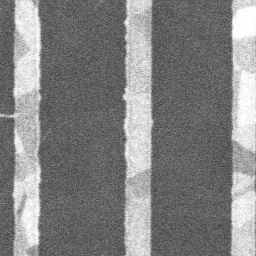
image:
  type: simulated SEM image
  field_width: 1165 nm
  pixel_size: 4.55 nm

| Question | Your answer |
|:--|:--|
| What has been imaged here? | one or a few lines or trenches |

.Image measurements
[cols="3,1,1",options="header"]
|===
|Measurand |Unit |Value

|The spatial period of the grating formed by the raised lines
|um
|0.495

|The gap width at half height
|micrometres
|0.391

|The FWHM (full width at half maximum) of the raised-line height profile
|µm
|0.102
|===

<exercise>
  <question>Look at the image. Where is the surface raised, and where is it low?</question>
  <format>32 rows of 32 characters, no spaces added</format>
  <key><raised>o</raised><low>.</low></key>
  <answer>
..ooo...........ooo..........ooo
..ooo...........ooo..........ooo
..ooo...........ooo..........ooo
..ooo...........ooo..........ooo
..ooo...........ooo..........ooo
..ooo...........ooo..........ooo
..ooo...........ooo..........ooo
..ooo...........ooo..........ooo
..ooo...........ooo..........ooo
..ooo...........ooo..........ooo
..ooo...........ooo..........ooo
..ooo...........ooo..........ooo
..ooo...........ooo..........ooo
..ooo...........ooo..........ooo
..ooo...........ooo..........ooo
..ooo...........ooo..........ooo
..ooo...........ooo..........ooo
..ooo...........ooo..........ooo
..ooo...........ooo..........ooo
..ooo...........ooo..........ooo
..ooo...........ooo..........ooo
..ooo...........ooo..........ooo
..ooo...........ooo..........ooo
..ooo...........ooo..........ooo
..ooo...........ooo..........ooo
..ooo...........ooo..........ooo
..ooo...........ooo..........ooo
..ooo...........ooo..........ooo
..ooo...........ooo..........ooo
..oo............ooo..........ooo
..ooo...........ooo..........ooo
..ooo...........ooo..........ooo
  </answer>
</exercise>